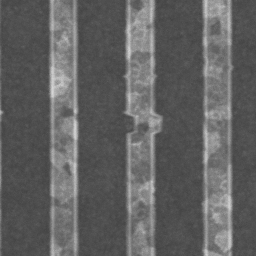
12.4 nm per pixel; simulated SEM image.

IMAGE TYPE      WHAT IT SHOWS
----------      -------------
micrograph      one or a few lines or trenches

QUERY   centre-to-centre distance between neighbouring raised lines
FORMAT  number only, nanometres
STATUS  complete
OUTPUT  954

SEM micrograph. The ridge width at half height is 0.283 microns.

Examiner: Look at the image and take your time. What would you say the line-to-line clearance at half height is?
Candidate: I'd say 670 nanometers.